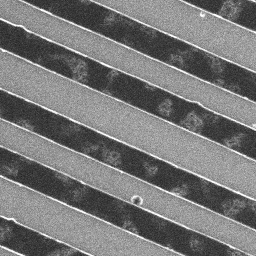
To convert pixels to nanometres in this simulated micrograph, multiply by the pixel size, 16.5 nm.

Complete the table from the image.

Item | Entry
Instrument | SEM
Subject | parallel lines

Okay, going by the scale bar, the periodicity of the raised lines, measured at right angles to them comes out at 957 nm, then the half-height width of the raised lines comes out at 466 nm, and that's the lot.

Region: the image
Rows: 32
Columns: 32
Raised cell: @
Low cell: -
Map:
---@@@@@@@@@@----------@@@@@@@@@
------@@@@@@@@@-----------@@@@@@
--------@@@@@@@@@-----------@@@@
@@@-------@@@@@@@@@------------@
@@@@@--------@@@@@@@@@----------
@@@@@@@--------@@@@@@@@@--------
-@@@@@@@@@-------@@@@@@@@@------
---@@@@@@@@@-------@@@@@@@@@----
-----@@@@@@@@@--------@@@@@@@@@-
--------@@@@@@@@@-------@@@@@@@@
----------@@@@@@@@@-------@@@@@@
@-----------@@@@@@@@@--------@@@
@@@------------@@@@@@@@@-------@
@@@@@@-----------@@@@@@@@@------
@@@@@@@@-----------@@@@@@@@@----
-@@@@@@@@@-----------@@@@@@@@@--
----@@@@@@@@------------@@@@@@@@
------@@@@@@@@@-----------@@@@@@
@-------@@@@@@@@@-----------@@@@
@@@--------@@@@@@@@-----------@@
@@@@@--------@@@@@@@@@----------
@@@@@@@@-------@@@@@@@@@--------
-@@@@@@@@@-------@@@@@@@@@------
---@@@@@@@@@--------@@@@@@@@----
------@@@@@@@@--------@@@@@@@@@-
--------@@@@@@@@@-------@@@@@@@@
----------@@@@@@@@@--------@@@@@
@@-----------@@@@@@@@--------@@@
@@@@-----------@@@@@@@@@-------@
@@@@@@-----------@@@@@@@@@------
@@@@@@@@-----------@@@@@@@@@----
--@@@@@@@@------------@@@@@@@@--